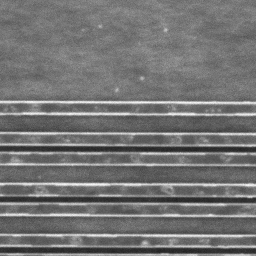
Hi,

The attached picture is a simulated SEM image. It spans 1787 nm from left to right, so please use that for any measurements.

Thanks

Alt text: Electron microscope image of parallel lines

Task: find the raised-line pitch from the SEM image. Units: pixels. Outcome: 26.5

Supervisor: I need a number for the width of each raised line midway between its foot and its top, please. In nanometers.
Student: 89